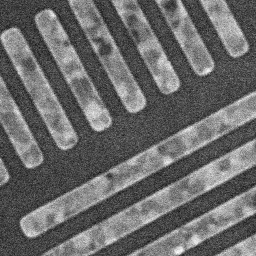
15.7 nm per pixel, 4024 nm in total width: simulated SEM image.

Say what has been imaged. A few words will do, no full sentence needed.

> groups of lines, slits or small figures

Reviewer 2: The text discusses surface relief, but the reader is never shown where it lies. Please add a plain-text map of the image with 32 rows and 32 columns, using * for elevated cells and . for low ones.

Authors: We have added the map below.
.........***..***...***..***....
.....*...***...***..***...***...
.....**...***..***...***..***...
.....***..***...***..***...***..
***..***...***..***...***...**..
***...***..***...***...**...***.
.***..***...***...**...***...**.
..**...***...**...***...**......
..***...**...***...**...***.....
...**...***...**...***..........
...***...**...***...**..........
*...***..***...***..............
**..***...***..***............**
**...***..***...**..........****
***..***...***............******
***...***..***...........*****..
.***..***..............*****....
.***...***...........******.....
..***...*..........******.....**
...**............******.....****
...**..........******.....******
*............******.....******..
*...........*****......*****....
..........*****......*****......
........******.....******.....**
......******.....******.....****
....******.....******.....******
...*****.....******.....******..
...***.....******......*****....
..........*****......*****......
........******.....*****......**
......******.....******.....****